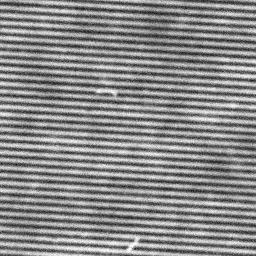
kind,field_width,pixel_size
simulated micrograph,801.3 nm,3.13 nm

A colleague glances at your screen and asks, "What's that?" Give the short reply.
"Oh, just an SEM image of parallel lines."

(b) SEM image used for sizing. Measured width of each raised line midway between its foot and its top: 10.9 nm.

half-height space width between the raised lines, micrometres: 0.0137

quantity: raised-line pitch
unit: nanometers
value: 23.8